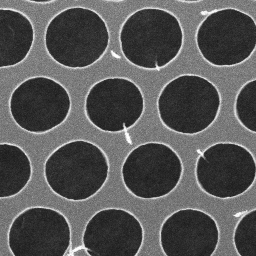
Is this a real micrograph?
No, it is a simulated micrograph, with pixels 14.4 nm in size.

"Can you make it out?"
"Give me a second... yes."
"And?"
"holes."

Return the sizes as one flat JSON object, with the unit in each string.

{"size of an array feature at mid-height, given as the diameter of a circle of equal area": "862 nm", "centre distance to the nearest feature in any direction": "1070 nm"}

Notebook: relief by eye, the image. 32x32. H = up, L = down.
HHHHHHHHHHHHHHHHHHHHHHHHHHHHHHHH
LLHHHHHHLLLLHHHHHLLLLHHHHHHLLLHH
LLLHHHHLLLLLLHHHLLLLLLHHHHLLLLLL
LLLLHHLLLLLLLHHLLLLLLLLHHLLLLLLL
LLLLHHLLLLLLLLHLLLLLLLLHHLLLLLLL
LLLLHHLLLLLLLHHLLLLLLLLHHLLLLLLL
LLLHHHLLLLLLLHHLLLLLLLHHHLLLLLLH
LLLHHHHLLLLLHHHHLLLLLHHHHHLLLLHH
HHHHHHHHHHHHHHHHHHLHHHHHHHHHHHHH
HHHHHHHHHHHHHHHHHHHHHHHLLHHHHHHH
HHHLLLLHHHHHLLLLLHHHHLLLLLHHHHHL
HHLLLLLLHHHLLLLLLLHHLLLLLLLHHHLL
HLLLLLLLLHHLLLLLLLHHLLLLLLLLHHLL
HLLLLLLLLHHLLLLLLLHHLLLLLLLHHHLL
HHLLLLLLHHHLLLLLLHHHLLLLLLLHHHLL
HHLLLLLHHHHHLLLLLHHHHLLLLLHHHHLL
HHHHLHHHHHHHHHHHHHHHHHHLLHHHHHHH
HHHHHHHHHHHHHHHHHHHHHHHHHHHHHHHH
LLHHHHHLLLLLHHHHHLLLLHHHHHLLLLHH
LLLHHHLLLLLLLHHHLLLLLLHHHLLLLLLH
LLLLHHLLLLLLLHHHLLLLLLLHHLLLLLLL
LLLLHHLLLLLLLHHLLLLLLLLHHLLLLLLL
LLLLHHLLLLLLLHHLLLLLLLHHHLLLLLLL
LLLHHHLLLLLLHHHHLLLLLLHHHLLLLLLH
LHHHHHHHLLLHHHHHHLLLHHHHHHHLLHHH
HHHHHHHHHHHHHHHHHHHHHHHHHHHHHHHH
HHHLLLLHHHHHLLLLHHHHHHLLLHHHHHHL
HHLLLLLLHHHLLLLLLHHHHLLLLLLHHHLL
HLLLLLLLLHHLLLLLLLHHLLLLLLLHHHLL
HLLLLLLLLHLLLLLLLLHHLLLLLLLHHLLL
HLLLLLLLLHHLLLLLLLHHLLLLLLLHHLLL
HHLLLLLLHHHLLLLLLHHHHLLLLLLHHHLL